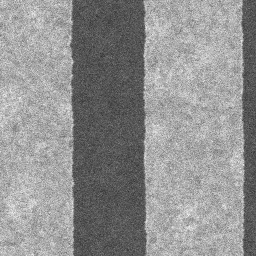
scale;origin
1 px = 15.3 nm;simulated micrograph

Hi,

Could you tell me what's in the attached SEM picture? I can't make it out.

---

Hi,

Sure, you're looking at one or a few lines or trenches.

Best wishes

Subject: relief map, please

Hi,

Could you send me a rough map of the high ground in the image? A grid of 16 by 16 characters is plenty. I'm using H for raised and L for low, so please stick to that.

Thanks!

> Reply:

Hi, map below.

HHHHLLLLLHHHHHHL
HHHHLLLLLHHHHHHL
HHHHLLLLLHHHHHHL
HHHHHLLLLHHHHHHL
HHHHLLLLLHHHHHHL
HHHHLLLLLHHHHHHL
HHHHLLLLLHHHHHHL
HHHHHLLLLHHHHHHL
HHHHHLLLLHHHHHHL
HHHHHLLLLHHHHHHL
HHHHLLLLLHHHHHHL
HHHHHLLLLHHHHHHL
HHHHHLLLLHHHHHHL
HHHHHLLLLHHHHHHL
HHHHHLLLLHHHHHHL
HHHHHLLLLHHHHHHL